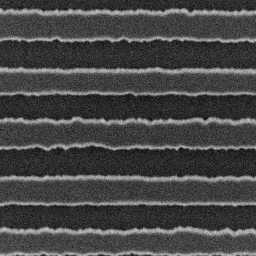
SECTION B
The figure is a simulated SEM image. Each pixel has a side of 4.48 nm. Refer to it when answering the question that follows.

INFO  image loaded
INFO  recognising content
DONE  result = lines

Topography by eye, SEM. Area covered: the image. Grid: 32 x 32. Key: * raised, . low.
................................
*****.****.***..***..******...*.
********************************
********************************
********************************
................................
................................
................................
................................
********************************
********************************
********************************
................................
................................
................................
********************************
********************************
********************************
****.**.*....*******************
................................
................................
................................
********************************
********************************
********************************
****************..**************
................................
................................
................................
********************************
********************************
********************************